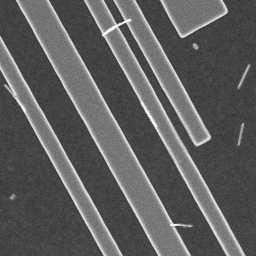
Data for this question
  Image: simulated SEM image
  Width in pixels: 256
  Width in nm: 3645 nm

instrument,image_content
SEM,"groups of lines, slits or small figures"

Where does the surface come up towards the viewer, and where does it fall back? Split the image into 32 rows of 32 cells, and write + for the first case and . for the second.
..++++.....++.+++...++++++++....
...++++....+++.+++...+++++++....
...++++.....++.+++...++++++.....
....++++....+++.+++...+++.......
.....++++....++..++.............
.....++++.....++.+++............
+.....++++....++..+++...........
++....++++.....++.+++...........
++.....++++....+++.+++..........
+++....++++.....++.+++..........
.++.....++++....+++.+++.........
..++....++++.....++..++.........
..++.....++++....+++.+++........
...++.....++++....++..++........
...+++....++++....+++.+++.......
....++.....++++....++..++.......
....+++....++++.....++..++......
.....++.....++++....++..++......
.....+++....++++.....++.........
......++.....++++....+++........
.......++.....+++.....++........
.......++.....++++.....++.......
........++.....++++....++.......
........+++....++++.....++......
.........++.....++++....+++.....
.........+++....++++.....++.....
..........++.....++++....+++....
...........++....++++.....++....
...........++.....++++....+++...
............++....++++.....++...
............++.....++++.....++..
.............++.....+++.....++..